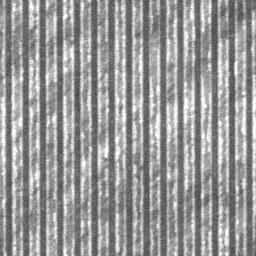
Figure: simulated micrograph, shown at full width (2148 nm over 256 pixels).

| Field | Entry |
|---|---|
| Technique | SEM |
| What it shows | parallel lines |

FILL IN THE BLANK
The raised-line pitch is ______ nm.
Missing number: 144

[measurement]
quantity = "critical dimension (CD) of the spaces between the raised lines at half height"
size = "0.064 microns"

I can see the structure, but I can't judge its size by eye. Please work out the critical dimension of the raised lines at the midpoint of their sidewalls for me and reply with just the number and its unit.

0.085 um